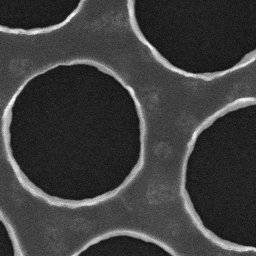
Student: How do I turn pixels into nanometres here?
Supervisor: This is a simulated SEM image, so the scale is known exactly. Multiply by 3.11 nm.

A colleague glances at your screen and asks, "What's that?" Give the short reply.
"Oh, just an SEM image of holes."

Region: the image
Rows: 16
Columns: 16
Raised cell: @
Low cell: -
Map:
-----@@@--------
----@@@@@-------
@@@@@@@@@-------
@@@@@@@@@@------
@@@----@@@@@--@@
@-------@@@@@@@@
@-------@@@@@@@-
@--------@@@@---
@--------@@@----
@--------@@@----
@-------@@@@----
@@------@@@-----
@@@--@@@@@@@----
@@@@@@@@@@@@----
-@@@@@@@@@@@@---
-@@@@-----@@@@@@